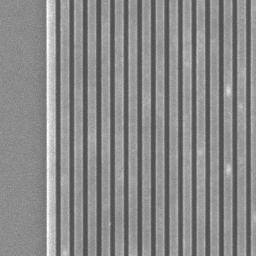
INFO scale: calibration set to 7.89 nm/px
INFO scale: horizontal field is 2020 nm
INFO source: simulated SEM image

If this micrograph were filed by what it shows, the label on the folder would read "parallel lines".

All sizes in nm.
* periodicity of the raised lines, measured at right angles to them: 107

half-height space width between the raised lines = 45.4 nm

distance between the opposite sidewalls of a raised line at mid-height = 60.2 nm